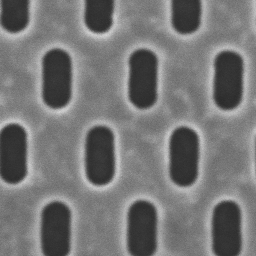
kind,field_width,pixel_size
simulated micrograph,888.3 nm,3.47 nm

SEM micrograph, holes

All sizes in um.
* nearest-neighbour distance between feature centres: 0.296